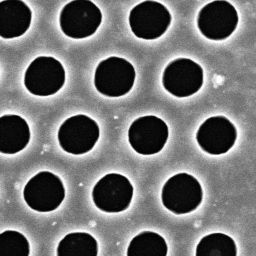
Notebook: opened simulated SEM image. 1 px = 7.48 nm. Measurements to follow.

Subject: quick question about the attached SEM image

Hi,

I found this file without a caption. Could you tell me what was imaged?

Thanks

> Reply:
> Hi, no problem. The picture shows a regular array of holes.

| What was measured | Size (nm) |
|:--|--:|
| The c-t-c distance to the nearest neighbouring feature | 500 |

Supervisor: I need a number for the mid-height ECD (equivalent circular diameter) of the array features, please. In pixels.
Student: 40.3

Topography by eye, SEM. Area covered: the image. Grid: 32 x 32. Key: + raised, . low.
...+++++....+++++...++++++...+++
....++++.....+++.....++++.....++
....+++......+++.....++++.....++
....++++....++++.....++++....+++
...++++++..++++++...++++++...+++
++++++++++++++++++++++++++++++++
++++++++++++++++++++++++++++++++
++++...++++++...++++++..++++++++
++++....++++.....++++....+++++++
+++.....++++.....+++.....+++++++
+++.....++++.....+++.....+++++++
++++...+++++....+++++....+++++++
++++++++++++++++++++++++++++++++
++++++++++++++++++++++++++++++++
..+++++++..+++++++.++++++++.++++
...+++++....++++.....++++....+++
....+++.....++++.....++++....+++
....+++.....++++.....++++....+++
...+++++....+++++...+++++....+++
++++++++++++++++++++++++++++++++
++++++++++++++++++++++++++++++++
+++++.++++++++++++++++++++++++++
++++...+++++....+++++....+++++++
+++.....++++.....+++.....+++++++
+++.....++++.....+++.....+++++++
+++.....++++....++++.....+++++++
++++++++++++++.+++++++..++++++++
++++++++++++++++++++++++++++++++
++++++++++++++++++++++++++++++++
...+++++....+++++...++++++...+++
....+++.....++++.....++++....+++
....+++.....++++.....+++......++